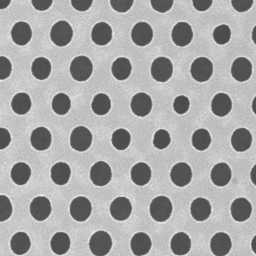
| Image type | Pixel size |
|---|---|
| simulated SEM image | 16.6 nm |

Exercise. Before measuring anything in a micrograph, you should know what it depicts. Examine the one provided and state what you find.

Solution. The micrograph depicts a regular array of holes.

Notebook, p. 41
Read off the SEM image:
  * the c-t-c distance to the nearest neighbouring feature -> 662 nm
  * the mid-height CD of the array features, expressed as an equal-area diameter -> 0.382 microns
